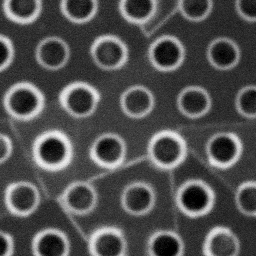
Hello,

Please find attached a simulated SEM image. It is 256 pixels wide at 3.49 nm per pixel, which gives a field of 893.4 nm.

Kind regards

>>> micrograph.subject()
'a regular array of holes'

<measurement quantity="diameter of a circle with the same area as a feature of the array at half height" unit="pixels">27.8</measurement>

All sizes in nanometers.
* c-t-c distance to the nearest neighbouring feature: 194